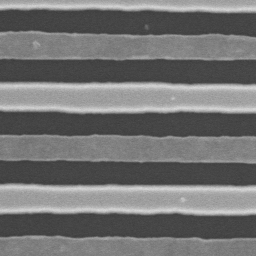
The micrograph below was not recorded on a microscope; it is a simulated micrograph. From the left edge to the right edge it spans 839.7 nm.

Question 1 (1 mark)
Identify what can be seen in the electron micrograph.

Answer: lines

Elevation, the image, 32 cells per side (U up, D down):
UUUUUUUUUUUUUUUUUUUUUUUUUUUUUUUU
DDDDDDDDDDDDDDDDDDDDDDDDDDDDDDDD
DDDDDDDDDDDDDDDDDDDDDDDDDDDDDDDD
DDDDDDDDDDDDDDDDDDDDDDDDDDDDDDDD
UUUUUUUUUUUUUUUUUUUUUUUUUUUUUUUD
UUUUUUUUUUUUUUUUUUUUUUUUUUUUUUUU
UUUUUUUUUUUUUUUUUUUUUUUUUUUUUUUU
DDDDDDDDDDDDDDDDDDDDDDDDDDDDDDDD
DDDDDDDDDDDDDDDDDDDDDDDDDDDDDDDD
DDDDDDDDDDDDDDDDDDDDDDDDDDDDDDDD
UUUUUUDUDDDUDDDUUUUUDDDDDDDDDDDD
UUUUUUUUUUUUUUUUUUUUUUUUUUUUUUUU
UUUUUUUUUUUUUUUUUUUUUUUUUUUUUUUU
UUUUUUUUUUUUUUUUUUUUUUUUUUUUUUUU
DDDDDDDDDDDDDDDDDDDDDDDDDDDDDDDD
DDDDDDDDDDDDDDDDDDDDDDDDDDDDDDDD
DDDDDDDDDDDDDDDDDDDDDDDDDDDDDDDD
UUUUUUUUUUUUUUUUUUUUUUUUUUUUUUUU
UUUUUUUUUUUUUUUUUUUUUUUUUUUUUUUU
UUUUUUUUUUUUUUUUUUUUUUUUUUUUUUUU
DDDDDDDDDDDDDDDDDDDDDDDDDDDDDDDD
DDDDDDDDDDDDDDDDDDDDDDDDDDDDDDDD
DDDDDDDDDDDDDDDDDDDDDDDDDDDDDDDD
UUUUUUUUUUUUUUUUUUUUUUUUUUUUUUUU
UUUUUUUUUUUUUUUUUUUUUUUUUUUUUUUU
UUUUUUUUUUUUUUUUUUUUUUUUUUUUUUUU
UUUUDDUUUUDDUUDUUUUUUUUUUUUUUUUU
DDDDDDDDDDDDDDDDDDDDDDDDDDDDDDDD
DDDDDDDDDDDDDDDDDDDDDDDDDDDDDDDD
DDDDDDDDDDDDDDDDDDDDDDDDDDDDDDDD
UUUUUUUUUUUUUUUUUUUUUUUUUUUUUUUU
UUUUUUUUUUUUUUUUUUUUUUUUUUUUUUUU